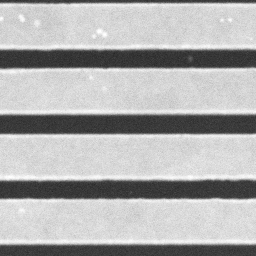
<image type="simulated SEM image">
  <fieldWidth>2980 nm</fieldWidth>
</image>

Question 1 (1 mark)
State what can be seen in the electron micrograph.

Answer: lines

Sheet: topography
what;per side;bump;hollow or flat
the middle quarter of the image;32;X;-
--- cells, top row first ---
--------------------------------
XXXXXXXXXXXXXXXXXXXXXXXXXXXXXXXX
XXXXXXXXXXXXXXXXXXXXXXXXXXXXXXXX
XXXXXXXXXXXXXXXXXXXXXXXXXXXXXXXX
XXXXXXXXXXXXXXXXXXXXXXXXXXXXXXXX
XXXXXXXXXXXXXXXXXXXXXXXXXXXXXXXX
XXXXXXXXXXXXXXXXXXXXXXXXXXXXXXXX
XXXXXXXXXXXXXXXXXXXXXXXXXXXXXXXX
XXXXXXXXXXXXXXXXXXXXXXXXXXXXXXXX
XXXXXXXXXXXXXXXXXXXXXXXXXXXXXXXX
XXXXXXXXXXXXXXXXXXXXXXXXXXXXXXXX
XXXXXXXXXXXXXXXXXXXXXXXXXXXXXXXX
-XXXXXX--XXXX-----XXXX-X--------
--------------------------------
--------------------------------
--------------------------------
--------------------------------
--------------------------------
XXXXXXXXXXXXXXXXXXXXXXXXXXXXXXXX
XXXXXXXXXXXXXXXXXXXXXXXXXXXXXXXX
XXXXXXXXXXXXXXXXXXXXXXXXXXXXXXXX
XXXXXXXXXXXXXXXXXXXXXXXXXXXXXXXX
XXXXXXXXXXXXXXXXXXXXXXXXXXXXXXXX
XXXXXXXXXXXXXXXXXXXXXXXXXXXXXXXX
XXXXXXXXXXXXXXXXXXXXXXXXXXXXXXXX
XXXXXXXXXXXXXXXXXXXXXXXXXXXXXXXX
XXXXXXXXXXXXXXXXXXXXXXXXXXXXXXXX
XXXXXXXXXXXXXXXXXXXXXXXXXXXXXXXX
XXXXXXXXXXXXXXXXXXXXXXXXXXXXXXXX
--------------------------------
--------------------------------
--------------------------------